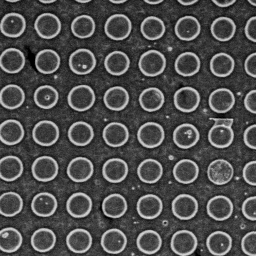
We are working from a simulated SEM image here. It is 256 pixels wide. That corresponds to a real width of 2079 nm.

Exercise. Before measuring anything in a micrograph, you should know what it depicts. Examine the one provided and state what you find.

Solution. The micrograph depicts a regular array of raised bodies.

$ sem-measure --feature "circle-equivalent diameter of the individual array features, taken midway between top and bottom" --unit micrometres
0.191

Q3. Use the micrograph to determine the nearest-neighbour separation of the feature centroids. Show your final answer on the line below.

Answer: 283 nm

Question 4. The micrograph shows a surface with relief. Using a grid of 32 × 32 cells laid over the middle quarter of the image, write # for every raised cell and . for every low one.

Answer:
..#####....#####...######...####
..#####....####....######...####
....................###......###
................................
................................
....#...........................
..#####....####......##......###
..#####...######...#####....####
.######...######...######...####
.######...######...######...####
..#####....####.....####....####
...##................##......###
................................
................................
................................
..####.....####.....####.....###
.######...######...######...####
.######...######...######...####
.######...######...######...####
..####.....####....#####....####
............#........##......##.
................................
................................
................................
..#####....####.....###......###
.######...######...#####....####
.######...######...#####....####
.######...######...#####....####
..####.....####....#####....####
.............................##.
................................
................................